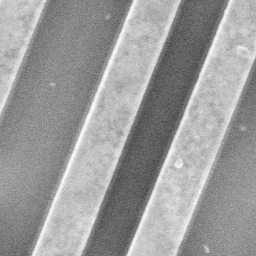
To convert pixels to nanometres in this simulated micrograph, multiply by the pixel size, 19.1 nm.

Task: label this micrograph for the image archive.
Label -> lines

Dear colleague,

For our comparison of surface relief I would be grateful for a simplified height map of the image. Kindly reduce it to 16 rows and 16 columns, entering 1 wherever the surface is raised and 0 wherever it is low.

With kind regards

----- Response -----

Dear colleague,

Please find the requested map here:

1110000011100011
1100000011100011
1100000111000111
1000000111000111
1000000110000111
1000001110001110
0000001110001110
0000011100011100
0000011100011100
0000011100011100
0000111000111000
0000111000111000
0001110001110000
0001110001110000
0001110001100000
0011100011100000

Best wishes